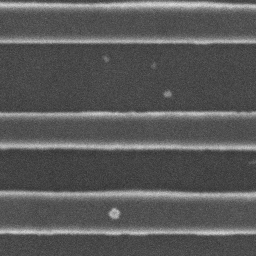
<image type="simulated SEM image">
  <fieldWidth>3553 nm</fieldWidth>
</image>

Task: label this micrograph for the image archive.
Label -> lines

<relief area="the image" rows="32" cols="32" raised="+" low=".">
................................
++++++++++++++++++++++++++++++++
++++++++++++++++++++++++++++++++
++++++++++++++++++++++++++++++++
++++++++++++++++++++++++++++++++
................................
................................
................................
................................
................................
................................
................................
................................
................................
++++++++++++++++++++++++++++++++
++++++++++++++++++++++++++++++++
++++++++++++++++++++++++++++++++
++++++++++++++++++++++++++++++++
................................
................................
................................
................................
................................
................................
++++++++++++++++++++++++++++++++
++++++++++++++++++++++++++++++++
++++++++++++++++++++++++++++++++
++++++++++++++++++++++++++++++++
++++++++++++++++++++++++++++++++
................................
................................
................................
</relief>